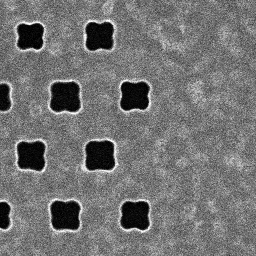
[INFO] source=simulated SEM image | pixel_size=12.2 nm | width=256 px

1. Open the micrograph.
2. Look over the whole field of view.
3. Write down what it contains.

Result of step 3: a regular array of holes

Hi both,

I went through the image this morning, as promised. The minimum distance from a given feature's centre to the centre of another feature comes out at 68.6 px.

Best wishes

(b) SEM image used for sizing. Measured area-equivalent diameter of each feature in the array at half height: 367 nanometres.